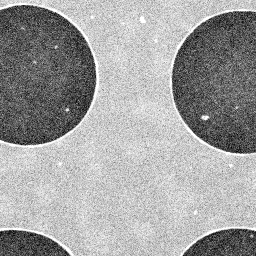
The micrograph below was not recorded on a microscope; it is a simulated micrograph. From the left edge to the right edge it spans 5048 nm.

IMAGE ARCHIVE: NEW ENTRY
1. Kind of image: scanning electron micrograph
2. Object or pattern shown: holes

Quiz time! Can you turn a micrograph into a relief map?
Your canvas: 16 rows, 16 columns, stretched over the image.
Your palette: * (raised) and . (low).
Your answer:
...*************
.....*******....
.....*******....
......*****.....
......*****.....
......*****.....
......*****.....
.....******.....
....********....
**************..
****************
****************
****************
****************
..***********...
....********....